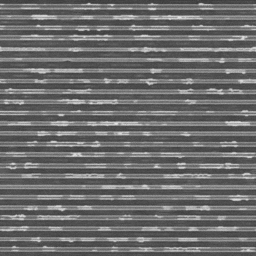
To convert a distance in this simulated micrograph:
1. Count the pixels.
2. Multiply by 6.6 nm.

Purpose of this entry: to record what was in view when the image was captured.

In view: parallel lines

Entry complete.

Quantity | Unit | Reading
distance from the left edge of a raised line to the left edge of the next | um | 0.0696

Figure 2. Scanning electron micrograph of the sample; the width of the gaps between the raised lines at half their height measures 45.4 nm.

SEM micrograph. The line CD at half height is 26.4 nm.